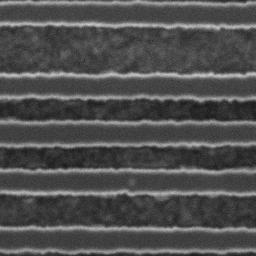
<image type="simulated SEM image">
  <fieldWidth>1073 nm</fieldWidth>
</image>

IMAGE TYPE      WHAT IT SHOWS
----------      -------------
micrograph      lines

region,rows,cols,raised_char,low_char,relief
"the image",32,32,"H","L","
HHHHHHHHHHHHHHHHHHHHHHHHHHHHHHHH
HHHHHHHHHHHHHHHHHHHHHHHHHHHHHHHH
HHHHHHHHHHHHHHHHHHHHHHHHHHHHHHHH
LLLLLLLLLLLLLLLLLLLLLLLLLLLLLHHL
LLLLLLLLLLLLLLLLLLLLLLLLLLLLLLLL
LLLLLLLLLLLLLLLLLLLLLLLLLLLLLLLL
LLLLLLLLLLLLLLLLLLLLLLLLLLLLLLLL
LLLLLLLLLLLLLLLLLLLLLLLLLLLLLLLL
LLLLLLLLLLLLLLLLLLLLLLLLLLLLLLLL
HHHHHHHHHHHHHHHHHHHHHHHHHHHHHHHH
HHHHHHHHHHHHHHHHHHHHHHHHHHHHHHHH
HHHHHHHHHHHHHHHHHHHHHHHHHHHHHHHH
LLLLLLLLLLLLLLLLLLLLLLLLLHLLHLHL
LLLLLLLLLLLLLLLLLLLLLLLLLLLLLLLL
LLLLLLLLLLLLLLLLLLLLLLLLLLLLLLLL
HHHHHHHHHHHHHHHHHHHHHHHHHHHHHHHH
HHHHHHHHHHHHHHHHHHHHHHHHHHHHHHHH
HHHHHHHHHHHHHHHHHHHHHHHHHHHHHHHH
LLLLLLLLLLLLLLLLLLLLLLLLLLLLLLLL
LLLLLLLLLLLLLLLLLLLLLLLLLLLLLLLL
LLLLLLLLLLLLLLLLLLLLLLLLLLLLLLLL
HHHHHHHHHHHHHHHHHHHHHHHHHHHHHHHH
HHHHHHHHHHHHHHHHHHHHHHHHHHHHHHHH
HHHHHHHHHHHHHHHHHHHHHHHHHHHHHHHH
LLLLLLLLLLLLLLLLLLLLLLLLLLLLLLLL
LLLLLLLLLLLLLLLLLLLLLLLLLLLLLLLL
LLLLLLLLLLLLLLLLLLLLLLLLLLLLLLLL
LLLLLLLLLLLLLLLLLLLLLLLLLLLLLLLL
HHHHHHHHHHHLHHHHHHHLLLHLHHLLLLHL
HHHHHHHHHHHHHHHHHHHHHHHHHHHHHHHH
HHHHHHHHHHHHHHHHHHHHHHHHHHHHHHHH
HHLLLHLHHHHHHHHLHHHHLHHHLHHHHLLL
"